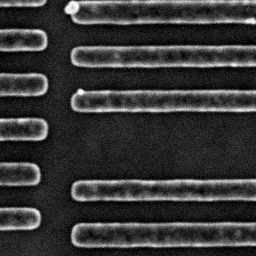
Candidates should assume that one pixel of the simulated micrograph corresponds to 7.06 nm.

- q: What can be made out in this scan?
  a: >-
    wiring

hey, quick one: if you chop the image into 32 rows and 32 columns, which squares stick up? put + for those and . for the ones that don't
+++++....+++++++++++++++++++++++
........++++++++++++++++++++++++
.........+++++++++++++++++++++++
................................
++++++..........................
++++++..........................
.........+++++++++++++++++++++++
.........+++++++++++++++++++++++
................................
+++++...........................
++++++..........................
++++++....++++++++++++++++++++++
.........+++++++++++++++++++++++
.........+++++++++++++++++++++++
................................
++++++..........................
++++++..........................
+++.+...........................
................................
................................
++++............................
+++++...........................
+++++...........................
.........+++++++++++++++++++++++
.........+++++++++++++++++++++++
................................
+++++...........................
+++++...........................
++++.....+++++++++++++++++++++++
.........+++++++++++++++++++++++
.........+++++++++++++++++++++++
................................